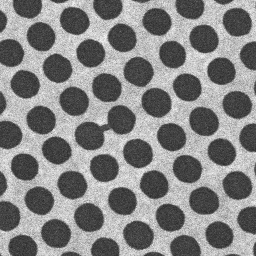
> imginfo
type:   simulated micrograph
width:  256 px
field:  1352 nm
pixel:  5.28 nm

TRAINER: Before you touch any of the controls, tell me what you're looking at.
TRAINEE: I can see a regular array of holes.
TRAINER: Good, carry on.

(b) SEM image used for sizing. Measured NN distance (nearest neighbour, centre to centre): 188 nanometres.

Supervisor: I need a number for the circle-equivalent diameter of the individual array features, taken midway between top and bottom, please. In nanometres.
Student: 153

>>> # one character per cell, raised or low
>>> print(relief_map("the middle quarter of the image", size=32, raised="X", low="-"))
--XXX---XXXXXXX-------XXX----XXX
--XXXXXXXXXXXXX-------XXXXXXXXXX
--XXXXXXX---XXX-------XXXXXXX---
-XXXXXXX-----XX-------XXXXXX----
XXXXXXX-------XX------XXXXX-----
XXXXXXX-------XXXX--XXXXXXX-----
-----XX-------XXXXXXX----XX-----
------X-------XXXXXX------XX----
------XX------XXXXX--------XX---
------XXXX--XXXXXXX--------XXXXX
------XXXXXXX---XXX--------XXXXX
------XXXXX------XXX-------XXXXX
X----XXXXXX-------XXX-----XXXXX-
XXXXXXXXXXX-------XXXXXXXXXXXXX-
XXXXX--XXXX-------XXXXXXXXXXXXX-
XXXX--------------XXXXXX-----XXX
XXX--------X-----XXXXXXX------XX
XXX-------XXXX--XXXXXXX-------XX
XXX-------XXXXXXXXXXXXX--------X
-XX-------XXXXXX-----XX--------X
--XX------XXXXX-------XX------XX
--XXXX--XXXXXXX-------XXXX---XXX
--XXXXXXXXXXXXX-------XXXXXXXXXX
-XXXXXX------XX-------XXXXXX----
XXXXXXX------XXX------XXXXX-----
XXXXXX--------XXX----XXXXXX-----
XXXXXXX-------XXXXXXXX-XXXX-----
----XXX------XXXXXXX-----XX-----
-----XX------XXXXXX-------XX----
------XXX--XXXXXXXX-------XXX---
------XXXXXXXXXXXXX-------XXXXXX
------XXXXXX-----XX-------XXXXXX